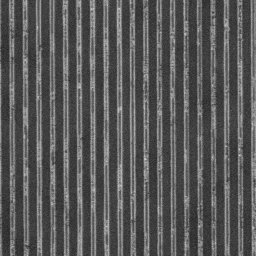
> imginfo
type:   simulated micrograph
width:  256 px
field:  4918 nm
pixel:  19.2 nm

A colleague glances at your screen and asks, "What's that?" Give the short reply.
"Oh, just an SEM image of parallel lines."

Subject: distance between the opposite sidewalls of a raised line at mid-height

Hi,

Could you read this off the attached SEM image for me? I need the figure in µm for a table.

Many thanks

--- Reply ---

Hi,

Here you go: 0.0744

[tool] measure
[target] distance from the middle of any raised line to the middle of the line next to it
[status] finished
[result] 258 nm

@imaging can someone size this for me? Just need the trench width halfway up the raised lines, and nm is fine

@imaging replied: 185